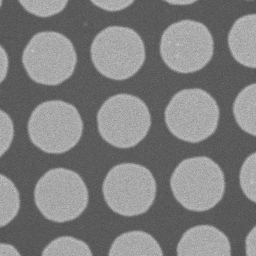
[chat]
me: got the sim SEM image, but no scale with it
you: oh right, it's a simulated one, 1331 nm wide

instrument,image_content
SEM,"an array of small figures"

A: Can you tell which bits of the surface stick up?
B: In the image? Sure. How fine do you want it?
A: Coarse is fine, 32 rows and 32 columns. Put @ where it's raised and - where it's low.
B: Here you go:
---@@@@@----@@@@------@@--------
----@@@-------------------------
------------------------------@@
-------------@@@-----@@@@@---@@@
----@@@@----@@@@@---@@@@@@---@@@
----@@@@@---@@@@@@--@@@@@@@--@@@
@--@@@@@@--@@@@@@@--@@@@@@@--@@@
@--@@@@@@@--@@@@@@--@@@@@@---@@@
@--@@@@@@---@@@@@----@@@@-------
@---@@@@@----@@@----------------
-----@@-------------------------
----------------------@@@@----@@
-------------@@@@@---@@@@@@--@@@
-----@@@@----@@@@@---@@@@@@--@@@
@---@@@@@@--@@@@@@@--@@@@@@--@@@
@@--@@@@@@--@@@@@@@--@@@@@@---@@
@@--@@@@@@--@@@@@@---@@@@@@----@
@---@@@@@@---@@@@@-----@@-------
@----@@@@------@----------------
-------------------------------@
---------------@@-----@@@@@---@@
------@@@-----@@@@@---@@@@@@--@@
@----@@@@@---@@@@@@--@@@@@@@--@@
@@--@@@@@@@--@@@@@@--@@@@@@@--@@
@@--@@@@@@@--@@@@@@---@@@@@@---@
@@--@@@@@@@--@@@@@@----@@@@-----
@@---@@@@@-----@@@--------------
@-----@@@-----------------------
------------------------@@@-----
---------------@@@@----@@@@@---@
@-----@@@@@---@@@@@@--@@@@@@@--@
@@---@@@@@@---@@@@@@--@@@@@@@--@